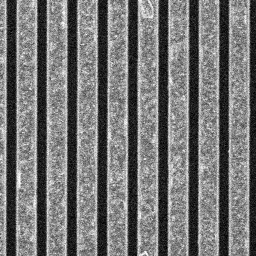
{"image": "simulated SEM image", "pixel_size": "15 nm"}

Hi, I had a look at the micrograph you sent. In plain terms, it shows parallel lines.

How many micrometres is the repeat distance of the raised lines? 0.455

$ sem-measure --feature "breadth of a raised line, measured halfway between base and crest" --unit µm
0.285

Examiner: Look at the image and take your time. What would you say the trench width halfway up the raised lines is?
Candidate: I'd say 169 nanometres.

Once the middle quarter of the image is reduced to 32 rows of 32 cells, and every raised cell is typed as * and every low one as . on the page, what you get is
....****...*****...****...*****.
....****...*****...****...*****.
....****...*****...****...*****.
....****...*****...****...*****.
....****...*****...****...*****.
...*****...*****...****...*****.
...*****...*****...****...*****.
...*****...*****...****...*****.
...*****...*****...****...*****.
...*****...*****...****...*****.
...*****...*****...****...*****.
*..*****...*****...****...*****.
*..*****...*****...****...*****.
*..*****...*****...****...*****.
*..*****...*****...****...*****.
*..*****...*****...****...*****.
*..*****...*****...****...*****.
*..*****...*****...****...*****.
*..*****...*****...****...*****.
...*****...*****...****...*****.
...*****...*****...****...*****.
...*****...*****...****...*****.
...*****...*****...****...*****.
...*****...*****...****...*****.
...*****...*****...****...*****.
...*****...*****...****...*****.
...*****...*****...****...*****.
...*****...*****...****...*****.
...*****...*****...****...*****.
...*****...*****...****...*****.
...*****...*****...****...*****.
...*****...*****...****...*****.